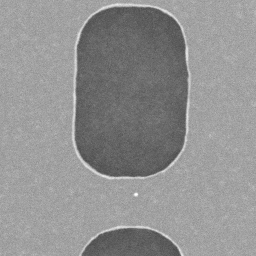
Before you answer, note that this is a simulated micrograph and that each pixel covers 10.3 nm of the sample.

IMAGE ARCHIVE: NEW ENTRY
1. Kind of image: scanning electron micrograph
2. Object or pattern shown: holes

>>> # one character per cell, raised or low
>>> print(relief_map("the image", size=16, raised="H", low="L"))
HHHHHHHLLLHHHHHH
HHHHHLLLLLLHHHHH
HHHHHLLLLLLLHHHH
HHHHHLLLLLLLHHHH
HHHHHLLLLLLLHHHH
HHHHHLLLLLLLHHHH
HHHHHLLLLLLLHHHH
HHHHHLLLLLLLHHHH
HHHHHLLLLLLLHHHH
HHHHHLLLLLLHHHHH
HHHHHHLLLLHHHHHH
HHHHHHHHHHHHHHHH
HHHHHHHHHHHHHHHH
HHHHHHHHHHHHHHHH
HHHHHHHLLLHHHHHH
HHHHHLLLLLLHHHHH